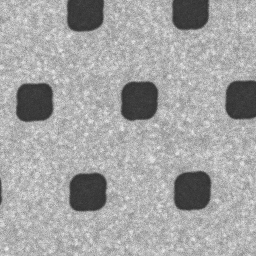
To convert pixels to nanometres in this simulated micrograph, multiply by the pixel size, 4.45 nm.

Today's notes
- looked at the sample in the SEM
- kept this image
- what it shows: holes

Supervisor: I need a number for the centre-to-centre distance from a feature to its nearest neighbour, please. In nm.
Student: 465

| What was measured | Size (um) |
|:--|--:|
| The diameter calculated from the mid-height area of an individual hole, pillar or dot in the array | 0.181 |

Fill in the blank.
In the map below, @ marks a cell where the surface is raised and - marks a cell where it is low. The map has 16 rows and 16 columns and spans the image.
@@@@---@@@@--@@@
@@@@--@@@@@--@@@
@@@@@@@@@@@@@@@@
@@@@@@@@@@@@@@@@
@@@@@@@@@@@@@@@@
@--@@@@@--@@@@--
@--@@@@@--@@@@--
@--@@@@@-@@@@@@@
@@@@@@@@@@@@@@@@
@@@@@@@@@@@@@@@@
@@@@@@@@@@@@@@@@
@@@@---@@@@--@@@
@@@@---@@@@--@@@
@@@@@@@@@@@@@@@@
@@@@@@@@@@@@@@@@
@@@@@@@@@@@@@@@@